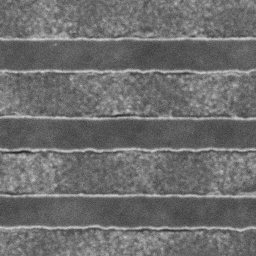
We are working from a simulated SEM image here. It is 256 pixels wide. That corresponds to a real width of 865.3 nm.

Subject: lines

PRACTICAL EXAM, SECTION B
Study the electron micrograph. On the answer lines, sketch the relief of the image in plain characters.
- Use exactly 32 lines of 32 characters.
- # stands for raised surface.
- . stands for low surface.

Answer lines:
................................
................................
................................
................................
................................
################################
################################
################################
################################
................................
................................
................................
................................
................................
................................
################################
################################
################################
################################
..#.............................
................................
....#...........................
................................
................................
#########################.#.....
################################
################################
################################
##....###....###################
................................
................................
................................